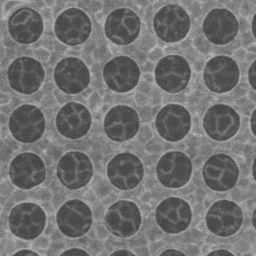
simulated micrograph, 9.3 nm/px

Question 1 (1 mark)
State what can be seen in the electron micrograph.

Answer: a regular array of holes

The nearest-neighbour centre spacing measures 438 nm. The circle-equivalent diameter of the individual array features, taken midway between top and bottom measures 356 nm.